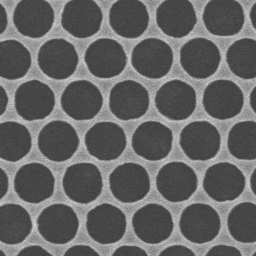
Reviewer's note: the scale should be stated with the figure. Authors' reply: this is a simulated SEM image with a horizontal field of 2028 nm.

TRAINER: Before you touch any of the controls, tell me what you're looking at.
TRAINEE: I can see a regular array of holes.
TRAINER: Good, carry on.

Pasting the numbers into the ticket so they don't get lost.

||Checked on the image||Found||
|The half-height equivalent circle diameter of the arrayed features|0.326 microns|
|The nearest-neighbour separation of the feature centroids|372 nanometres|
